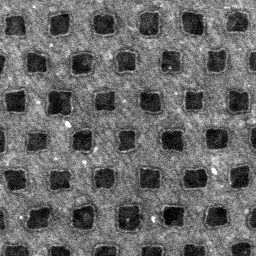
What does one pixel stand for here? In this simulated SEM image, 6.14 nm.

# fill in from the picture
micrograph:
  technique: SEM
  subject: a regular array of raised bodies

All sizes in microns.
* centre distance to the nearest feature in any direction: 0.268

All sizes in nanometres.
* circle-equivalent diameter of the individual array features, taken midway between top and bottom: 147